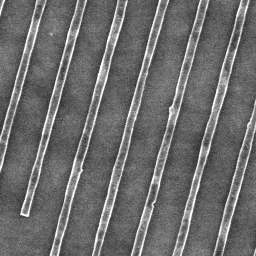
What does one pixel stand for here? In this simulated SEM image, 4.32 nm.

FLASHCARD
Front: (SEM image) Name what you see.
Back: parallel lines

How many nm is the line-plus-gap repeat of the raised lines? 170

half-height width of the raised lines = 34.4 nm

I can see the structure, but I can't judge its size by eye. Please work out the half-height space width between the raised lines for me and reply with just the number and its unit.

137 nm